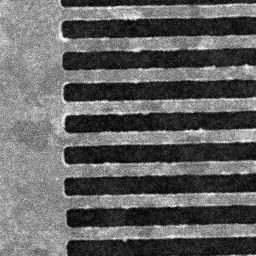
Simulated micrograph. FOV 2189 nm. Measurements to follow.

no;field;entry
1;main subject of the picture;parallel lines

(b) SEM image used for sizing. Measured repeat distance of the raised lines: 269 nm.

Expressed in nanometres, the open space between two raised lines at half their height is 163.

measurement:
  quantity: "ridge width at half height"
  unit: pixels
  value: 12.2